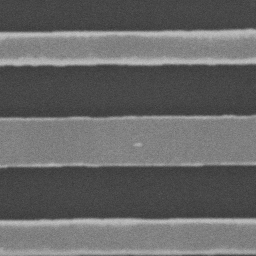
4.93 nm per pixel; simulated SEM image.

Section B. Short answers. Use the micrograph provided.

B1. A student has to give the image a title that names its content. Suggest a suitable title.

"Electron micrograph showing lines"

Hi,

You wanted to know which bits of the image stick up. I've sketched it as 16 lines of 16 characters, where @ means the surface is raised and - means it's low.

----------------
----------------
@@@@@@@@@@@@@@@@
@@@@@@@@@@@@@@@@
----------------
----------------
----------------
@@@@@@@@@@@@@@@@
@@@@@@@@@@@@@@@@
@@@@@@@@@@@@@@@@
----------------
----------------
----------------
----------------
@@@@@@@@@@@@@@@@
@@@@@@@@@@@@@@@@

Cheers